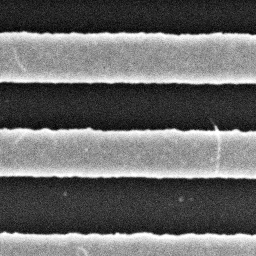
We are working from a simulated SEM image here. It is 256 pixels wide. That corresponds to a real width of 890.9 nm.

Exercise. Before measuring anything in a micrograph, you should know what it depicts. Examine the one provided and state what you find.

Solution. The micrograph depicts lines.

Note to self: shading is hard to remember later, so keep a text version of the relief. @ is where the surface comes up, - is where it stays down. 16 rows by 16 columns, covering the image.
----------------
----------------
@@@@@@@@@@@@@@@@
@@@@@@@@@@@@@@@@
@@@@@@@@@@@@@@@@
----------------
----------------
----------------
@@@@@@@@@@@@@@@@
@@@@@@@@@@@@@@@@
@@@@@@@@@@@@@@@@
----------------
----------------
----------------
----------------
@@@@@@@@@@@@@@@@